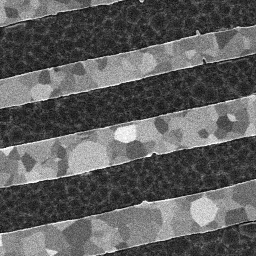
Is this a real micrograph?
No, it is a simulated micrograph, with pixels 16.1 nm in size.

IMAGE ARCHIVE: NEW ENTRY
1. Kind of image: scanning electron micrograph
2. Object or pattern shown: one or a few lines or trenches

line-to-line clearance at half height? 707 nm